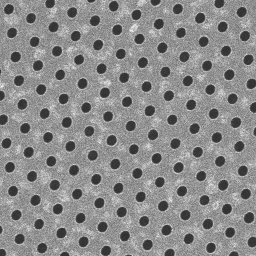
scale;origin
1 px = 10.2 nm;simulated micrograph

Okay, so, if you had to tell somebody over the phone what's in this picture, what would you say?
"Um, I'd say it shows a regular array of holes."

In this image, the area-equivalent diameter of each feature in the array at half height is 103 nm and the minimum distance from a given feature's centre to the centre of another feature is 243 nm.